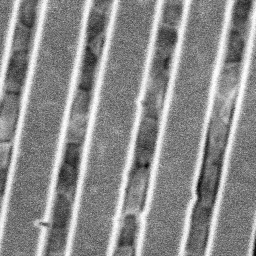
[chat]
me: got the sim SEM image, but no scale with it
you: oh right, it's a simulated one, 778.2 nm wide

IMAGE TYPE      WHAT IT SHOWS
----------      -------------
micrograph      one or a few lines or trenches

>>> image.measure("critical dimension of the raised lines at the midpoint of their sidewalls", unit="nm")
137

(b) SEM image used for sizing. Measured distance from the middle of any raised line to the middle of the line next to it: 211 nm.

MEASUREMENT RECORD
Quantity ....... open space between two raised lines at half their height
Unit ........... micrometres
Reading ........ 0.0758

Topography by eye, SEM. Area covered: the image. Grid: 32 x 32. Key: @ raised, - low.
@@---@@@@@@---@@@@@@---@@@@@@---
@@---@@@@@@---@@@@@@---@@@@@@---
@@---@@@@@@---@@@@@@---@@@@@----
@@---@@@@@@---@@@@@----@@@@@----
@----@@@@@---@@@@@@---@@@@@@---@
@---@@@@@@---@@@@@@---@@@@@@---@
@---@@@@@@---@@@@@@---@@@@@@---@
@---@@@@@@---@@@@@@---@@@@@----@
@---@@@@@@---@@@@@@---@@@@@----@
----@@@@@@--@@@@@@---@@@@@@---@@
---@@@@@@---@@@@@@---@@@@@@---@@
---@@@@@@---@@@@@@---@@@@@@---@@
---@@@@@@---@@@@@@---@@@@@@---@@
---@@@@@@---@@@@@@---@@@@@----@@
---@@@@@---@@@@@@---@@@@@@---@@@
--@@@@@@---@@@@@@---@@@@@@---@@@
--@@@@@@---@@@@@@---@@@@@@---@@@
--@@@@@@---@@@@@@---@@@@@@---@@@
--@@@@@@---@@@@@@---@@@@@---@@@@
--@@@@@---@@@@@@---@@@@@@---@@@@
-@@@@@@---@@@@@@---@@@@@@---@@@@
-@@@@@@---@@@@@@---@@@@@@---@@@@
-@@@@@@---@@@@@@---@@@@@@@@-@@@@
-@@@@@@---@@@@@@---@@@@@-@@@@@@@
-@@@@@----@@@@@---@@@@@@@--@@@@@
@@@@@@---@@@@@@---@@@@@@---@@@@@
@@@@@@---@@@@@@---@@@@@@---@@@@@
@@@@@@---@@@@@@---@@@@@@---@@@@@
@@@@@----@@@@@@---@@@@@---@@@@@@
@@@@@----@@@@@---@@@@@@---@@@@@@
@@@@@----@@@@@---@@@@@@---@@@@@@
@@@@@---@@@@@@---@@@@@@---@@@@@@